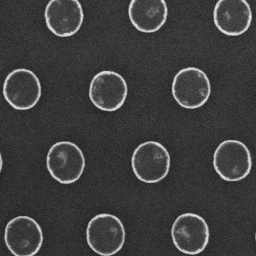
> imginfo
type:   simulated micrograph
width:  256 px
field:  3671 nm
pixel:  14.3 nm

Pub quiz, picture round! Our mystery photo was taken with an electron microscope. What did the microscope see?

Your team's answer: raised bodies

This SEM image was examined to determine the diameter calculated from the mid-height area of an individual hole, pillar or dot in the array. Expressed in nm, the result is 542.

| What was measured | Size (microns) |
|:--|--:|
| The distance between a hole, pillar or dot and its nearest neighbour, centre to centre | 1.19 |